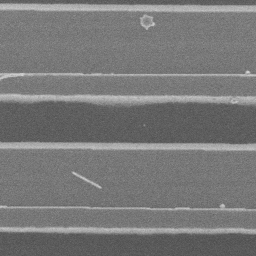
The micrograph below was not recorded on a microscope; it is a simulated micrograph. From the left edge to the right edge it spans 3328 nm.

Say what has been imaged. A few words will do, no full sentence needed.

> lines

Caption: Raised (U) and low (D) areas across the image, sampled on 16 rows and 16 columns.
UUDDDDDDDDDDDDDD
UUUUUUUUUUUUUUUU
UUUUUUUUUUUUUUUU
UUUUUUUUUUUUUUUU
UUUUUUUUUUUUUUUU
UUUUUUUUUUUUUUUU
DDDDDDDDDDDDDDDD
DDDDDDDDDDDDDDDD
DDDDDDDDDDDDDDDD
UUUUUUUUUUUUUUUU
UUUUUUUUUUUUUUUU
UUUUUUUUUUUUUUUU
UUUUUUUUUUUUUUUU
UUUUUUUUUUUUUUUU
DDDDDDDDDDDDDDDD
DDDDDDDDDDDDDDDD